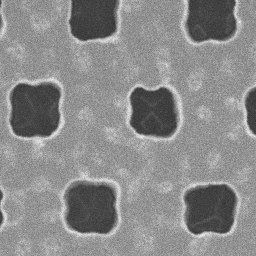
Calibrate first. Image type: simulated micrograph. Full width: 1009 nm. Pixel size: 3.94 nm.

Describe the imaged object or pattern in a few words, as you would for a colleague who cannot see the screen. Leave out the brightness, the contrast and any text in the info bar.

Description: holes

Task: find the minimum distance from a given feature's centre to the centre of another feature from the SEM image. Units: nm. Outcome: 441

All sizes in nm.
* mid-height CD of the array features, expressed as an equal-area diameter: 216